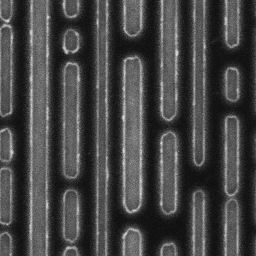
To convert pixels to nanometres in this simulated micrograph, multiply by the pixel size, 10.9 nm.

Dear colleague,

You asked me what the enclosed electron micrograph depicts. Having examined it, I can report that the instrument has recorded parallel lines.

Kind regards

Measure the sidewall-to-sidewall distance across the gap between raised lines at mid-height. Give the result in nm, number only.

134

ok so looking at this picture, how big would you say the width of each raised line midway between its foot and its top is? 21 pixels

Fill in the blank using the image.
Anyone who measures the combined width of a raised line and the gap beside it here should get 354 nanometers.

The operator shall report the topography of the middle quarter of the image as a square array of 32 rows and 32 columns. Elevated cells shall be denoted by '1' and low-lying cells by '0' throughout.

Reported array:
10011111000111100001111100001111
00011111000111100001111100001111
00011111000111100001111100001111
00011111000111100001111100001111
00011111000111100001111100001111
00011111000111100001111100001111
00011111001111100001111110001111
00011111000111100001111100001111
00011111001111100001111100001111
00011111001111100001111100001111
00011111000111100001111100001111
00011111000111100001111100001111
00011111000111100001111110001111
00011111000111100001111110011111
00011111000111100001111111111111
00011111000111100001111111111111
00011111000111100001111111111111
00011111000111100001111111011111
00011111000111100001111110001111
00011111000111100001111100001111
00011111000111100001111100001111
00011111000111100001111100001111
00011111100111100001111100001111
00011111000111100001111100001111
00011111000111100001111100001111
00011111000111100001111100001111
00011111000111100001111100001111
00011111000111100001111100001111
11111111000111100001111100001111
11111111000111100001111100001111
11111111000111100001111100001111
11111111000111100001111100001111